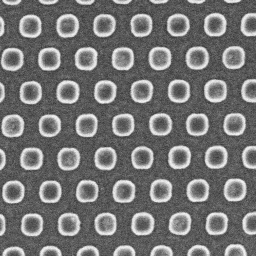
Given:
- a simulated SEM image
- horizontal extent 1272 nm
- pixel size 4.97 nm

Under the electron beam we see a regular array of raised bodies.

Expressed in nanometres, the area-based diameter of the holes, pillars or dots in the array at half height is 107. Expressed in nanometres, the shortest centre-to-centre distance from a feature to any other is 183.